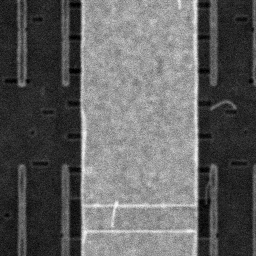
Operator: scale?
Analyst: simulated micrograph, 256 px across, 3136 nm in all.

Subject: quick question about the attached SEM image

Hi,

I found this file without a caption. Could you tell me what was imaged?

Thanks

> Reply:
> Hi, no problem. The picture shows wiring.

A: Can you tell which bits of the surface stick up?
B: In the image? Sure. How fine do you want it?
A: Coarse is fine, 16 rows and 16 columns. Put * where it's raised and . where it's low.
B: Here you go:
.....*******....
.....*******....
.....*******....
.....*******....
.....*******....
.....*******....
.....*******....
.....*******....
.....*******....
.....*******....
.....*******....
.....*******....
.....*******....
................
......******....
.....*******....